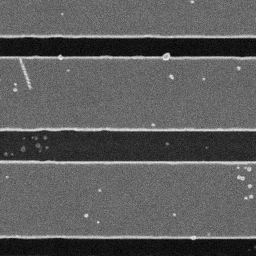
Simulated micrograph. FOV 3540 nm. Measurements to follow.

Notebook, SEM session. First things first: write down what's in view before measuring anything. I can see lines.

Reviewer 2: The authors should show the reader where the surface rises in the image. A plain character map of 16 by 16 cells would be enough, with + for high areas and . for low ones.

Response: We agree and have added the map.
++++++++++++++++
++++++++++++++++
................
..........+.....
++++++++++++++++
++++++++++++++++
++++++++++++++++
++++++++++++++++
................
................
++++++++++++++++
++++++++++++++++
++++++++++++++++
++++++++++++++++
++++++++++++++++
................